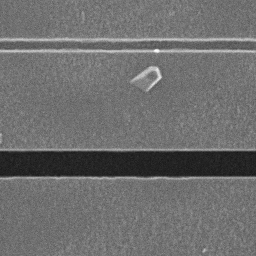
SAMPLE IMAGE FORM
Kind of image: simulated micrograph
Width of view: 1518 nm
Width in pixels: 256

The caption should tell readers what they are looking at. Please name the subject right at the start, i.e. lines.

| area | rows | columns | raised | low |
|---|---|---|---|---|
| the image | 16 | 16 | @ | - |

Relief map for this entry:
@@@@@@@@@@@@@@@@
@@@@@@@@@@@@@@@@
@@@@@@@@@@@@@@@@
@@@@@@@@@@@@@@@@
@@@@@@@@@@@@@@@@
@@@@@@@@@@@@@@@@
@@@@@@@@@@@@@@@@
@@@@@@@@@@@@@@@@
@@@@@@@@@@@@@@@@
----------------
----------------
@@@@@@@@@@@@@@@@
@@@@@@@@@@@@@@@@
@@@@@@@@@@@@@@@@
@@@@@@@@@@@@@@@@
@@@@@@@@@@@@@@@@